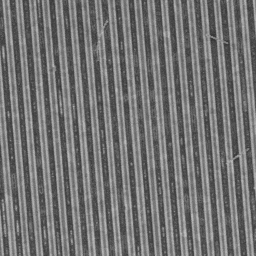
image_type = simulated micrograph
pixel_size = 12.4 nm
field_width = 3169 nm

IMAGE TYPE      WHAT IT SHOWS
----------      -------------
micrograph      parallel lines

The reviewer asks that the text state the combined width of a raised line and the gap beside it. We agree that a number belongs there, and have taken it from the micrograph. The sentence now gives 163 nm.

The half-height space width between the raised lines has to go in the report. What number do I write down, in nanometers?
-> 102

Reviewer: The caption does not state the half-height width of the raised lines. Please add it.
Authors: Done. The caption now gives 57 nm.